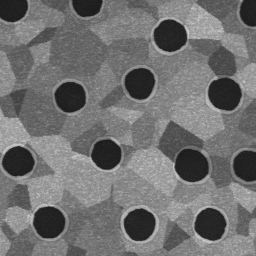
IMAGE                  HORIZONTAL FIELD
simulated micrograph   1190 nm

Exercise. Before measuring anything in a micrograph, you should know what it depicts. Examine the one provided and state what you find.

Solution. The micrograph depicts a regular array of holes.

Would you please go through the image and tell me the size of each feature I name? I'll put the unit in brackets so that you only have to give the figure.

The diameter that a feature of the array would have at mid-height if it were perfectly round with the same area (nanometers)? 160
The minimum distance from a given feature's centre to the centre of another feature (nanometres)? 315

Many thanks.